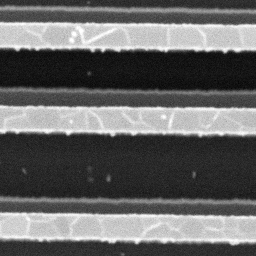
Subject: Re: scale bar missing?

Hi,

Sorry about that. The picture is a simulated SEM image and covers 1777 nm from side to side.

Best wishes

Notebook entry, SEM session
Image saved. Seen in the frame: lines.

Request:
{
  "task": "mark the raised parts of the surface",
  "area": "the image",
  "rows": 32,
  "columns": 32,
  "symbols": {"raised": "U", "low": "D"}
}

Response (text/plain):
DDDDDDDDDDDDDDDDDDDDDDDDDDDDDDDD
UUUUUUUUUUUUUUUUUUUUUUUUDDDUDDDD
UUUUUUUUUUUUUUUUUUUUUUUUUUUUUUUU
UUUUUUUUUUUUUUUUUUUUUUUUUUUUUUUU
UUUUUUUUUUUUUUUUUUUUUUUUUUUUUUUU
UUUUUUUUUUUUUUUUUUUUUUUUUUUUUUUU
DDDDDDDDDDDDDDDDDDDDDDDDDDDDDDDD
DDDDDDDDDDDDDDDDDDDDDDDDDDDDDDDD
DDDDDDDDDDDDDDDDDDDDDDDDDDDDDDDD
DDDDDDDDDDDDDDDDDDDDDDDDDDDDDDDD
DDDDDDDDDDDDDDDDDDDDDDDDDDDDDDDD
UUUUUUUUUUUUUUUUDUDUDDDDDDDDDDDD
UUUUUUUUUUUUUUUUUUUUUUUUUUUUUUUU
UUUUUUUUUUUUUUUUUUUUUUUUUUUUUUUU
UUUUUUUUUUUUUUUUUUUUUUUUUUUUUUUU
UUUUUUUUUUUUUUUUUUUUUUUUUUUUUUUU
UDUDDUDDUDDDUUUUUUUUUUUUUUUUUUUU
DDDDDDDDDDDDDDDDDDDDDDDDDDDDDDDD
DDDDDDDDDDDDDDDDDDDDDDDDDDDDDDDD
DDDDDDDDDDDDDDDDDDDDDDDDDDDDDDDD
DDDDDDDDDDDDDDDDDDDDDDDDDDDDDDDD
DDDDDDDDDDDDDDDDDDDDDDDDDDDDDDDD
DDDDDDDDDDDDDDDDDDDDDDDDDDDDDDDD
DDDDDDDDDDDDDDDDDDDDDDDDDDDDDDDD
DDDDDDDDDDDDDDDDDDDDDDDDDDDDDDDD
UUUUUUUUUUUUUUUUUUUUUUUUUUUUUUUU
UUUUUUUUUUUUUUUUUUUUUUUUUUUUUUUU
UUUUUUUUUUUUUUUUUUUUUUUUUUUUUUUU
UUUUUUUUUUUUUUUUUUUUUUUUUUUUUUUU
UUUUUUUUUUUUUUUUUUUUUUUUUUUUUUUU
DDDDDDDDDDDDDDDDDDDDDDDDDDDDDDDD
DDDDDDDDDDDDDDDDDDDDDDDDDDDDDDDD